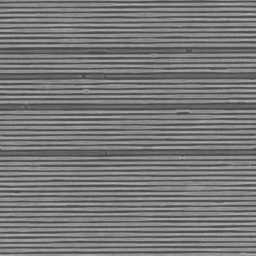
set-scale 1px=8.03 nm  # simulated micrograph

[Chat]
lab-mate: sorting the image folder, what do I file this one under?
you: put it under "parallel lines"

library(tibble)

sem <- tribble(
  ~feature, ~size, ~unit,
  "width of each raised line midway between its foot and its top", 19.1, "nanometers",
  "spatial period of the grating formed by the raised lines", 41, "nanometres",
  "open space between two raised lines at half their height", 25.1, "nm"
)